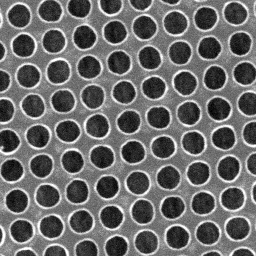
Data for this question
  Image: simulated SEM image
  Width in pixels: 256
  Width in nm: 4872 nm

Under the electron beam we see a regular array of holes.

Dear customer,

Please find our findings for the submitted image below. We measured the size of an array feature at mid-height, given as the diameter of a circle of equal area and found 0.45 µm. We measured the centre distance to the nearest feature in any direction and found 570 nanometers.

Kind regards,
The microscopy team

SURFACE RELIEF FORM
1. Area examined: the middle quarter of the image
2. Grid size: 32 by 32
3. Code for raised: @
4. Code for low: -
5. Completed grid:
-@@------@@------@@-----@@@@@@@@
--@------@@-----@@@@@@@@@@@@@@@@
--@@-----@@@@--@@@@@@@@@@@@@----
-@@@@--@@@@@@@@@@@@@@---@@@-----
@@@@@@@@@@@@@@--@@@@-----@@-----
@@@@@@---@@@@----@@-------@@----
-@@@@-----@@------@------@@@----
--@@------@@------@@-----@@@@---
---@------@@------@@@---@@@@@@@@
---@@-----@@@@---@@@@@@@@@@@@@--
---@@----@@@@@@@@@@@@@@@@@@@@---
--@@@@@@@@@@@@@@@@@@@-----@@----
@@@@@@@@-@@@@@-----@@-----@@----
@@@@@@----@@@@-----@@------@@---
---@@------@@------@@------@@---
----@------@@------@@@----@@@@@@
----@------@@@----@@@@@@@@@@@@@@
----@@-----@@@@@@@@@@@@@@@@@@@--
---@@@@@-@@@@@@@@@@@@@@----@@@--
--@@@@@@@@@@@@@@---@@@-----@@---
@@@@@@@@--@@@@@-----@@------@@--
@-@@@@@-----@@------@@------@@--
----@@@-----@@------@@-----@@@@@
-----@@------@@-----@@@@--@@@@@@
-----@@-----@@@@---@@@@@@@@@@@@@
-----@@@----@@@@@@@@@@@@@--@@@@-
----@@@@@@@@@@@@@@@@@@@@----@@@-
@@@@@@@@@@@@@@@@@----@@------@@-
@@@@@@@@@----@@@-----@@------@@-
@@---@@@-----@@-------@------@@@
@-----@@------@@-----@@@----@@@@
------@@------@@-----@@@@@@@@@@@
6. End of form